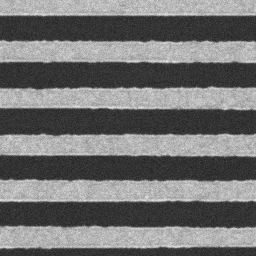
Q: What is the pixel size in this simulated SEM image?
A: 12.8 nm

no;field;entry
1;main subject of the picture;lines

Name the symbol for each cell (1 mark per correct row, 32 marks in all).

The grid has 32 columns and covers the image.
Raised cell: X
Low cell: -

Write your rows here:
XXXXXXXXXXXXXXXXXXXXXXXXXXXXXXXX
XXXXXXXXXXXXXXXXXXXXXXXXXXXXXXXX
--------------------------------
--------------------------------
--------------------------------
XXXXXXXXXXXXXXXXXXXXXXXXXXXXXXXX
XXXXXXXXXXXXXXXXXXXXXXXXXXXXXXXX
XXXXXXXXXXXXXXXXXXXXXXXXXXXXXXXX
--------------------------------
--------------------------------
--------------------------------
XXXXXXXXXXXXXXXXXXXXXXXXXXXXXXXX
XXXXXXXXXXXXXXXXXXXXXXXXXXXXXXXX
-----------XXXXXXXXXXXXXXXXXXXXX
--------------------------------
--------------------------------
--------------------------------
XXXXXXXXXXXXXXXXXXXXXXXXXXXXXXXX
XXXXXXXXXXXXXXXXXXXXXXXXXXXXXXXX
--------------------------------
--------------------------------
--------------------------------
--------------------------------
XXXXXXXXXXXXXXXXXXXXXXXXXXXXXXXX
XXXXXXXXXXXXXXXXXXXXXXXXXXXXXXXX
--------------------------------
--------------------------------
--------------------------------
XXXXXXXX-XXXXXXX----XXX---------
XXXXXXXXXXXXXXXXXXXXXXXXXXXXXXXX
XXXXXXXXXXXXXXXXXXXXXXXXXXXXXXXX
--------------------------------